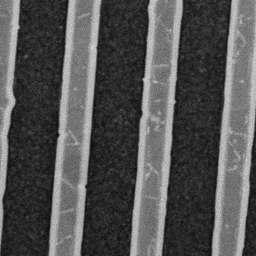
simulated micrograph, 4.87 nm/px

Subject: one or a few lines or trenches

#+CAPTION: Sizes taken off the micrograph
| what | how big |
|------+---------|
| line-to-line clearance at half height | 270 nanometres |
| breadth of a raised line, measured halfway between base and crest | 128 nm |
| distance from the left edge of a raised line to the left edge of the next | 0.396 um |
